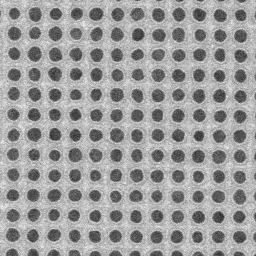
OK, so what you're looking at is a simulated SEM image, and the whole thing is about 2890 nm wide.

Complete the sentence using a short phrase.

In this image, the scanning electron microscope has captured a regular array of holes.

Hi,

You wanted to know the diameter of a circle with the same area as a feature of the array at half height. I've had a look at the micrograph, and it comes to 153 nm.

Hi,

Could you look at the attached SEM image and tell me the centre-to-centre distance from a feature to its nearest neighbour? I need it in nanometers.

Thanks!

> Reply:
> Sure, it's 224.